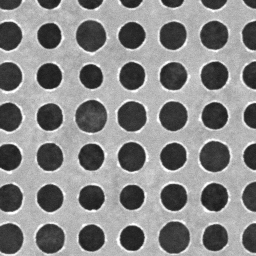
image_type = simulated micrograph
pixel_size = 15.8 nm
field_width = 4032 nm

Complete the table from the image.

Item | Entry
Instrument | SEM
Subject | a regular array of holes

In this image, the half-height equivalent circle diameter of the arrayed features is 0.436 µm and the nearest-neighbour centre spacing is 633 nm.